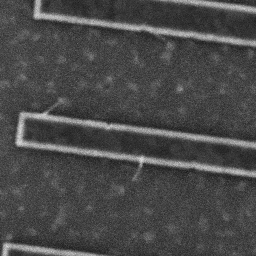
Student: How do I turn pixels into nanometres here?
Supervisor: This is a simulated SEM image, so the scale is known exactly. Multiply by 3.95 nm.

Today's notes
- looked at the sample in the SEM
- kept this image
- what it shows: one or a few lines or trenches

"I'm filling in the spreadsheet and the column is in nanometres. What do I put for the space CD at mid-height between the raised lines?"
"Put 397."